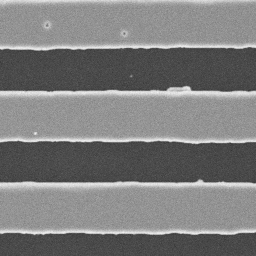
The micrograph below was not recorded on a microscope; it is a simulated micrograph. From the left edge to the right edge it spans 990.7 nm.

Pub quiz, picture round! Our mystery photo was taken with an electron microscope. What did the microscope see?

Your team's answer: lines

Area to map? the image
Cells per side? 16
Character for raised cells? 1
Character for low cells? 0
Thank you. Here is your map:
1111111111111111
1111111111111111
1111111111111111
0000000000000000
0000000000000000
0000000000000000
1111111111111111
1111111111111111
1111111111111111
0000000000000000
0000000000000000
1111111111111111
1111111111111111
1111111111111111
1111111111111111
0000000000000000